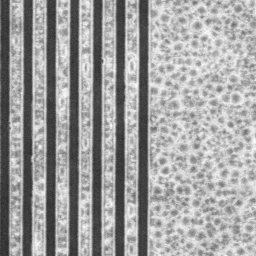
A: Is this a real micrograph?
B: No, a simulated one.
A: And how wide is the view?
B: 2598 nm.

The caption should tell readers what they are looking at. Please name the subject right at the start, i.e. parallel lines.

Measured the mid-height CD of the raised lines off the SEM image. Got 119 nm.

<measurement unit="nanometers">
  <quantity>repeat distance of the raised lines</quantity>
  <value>234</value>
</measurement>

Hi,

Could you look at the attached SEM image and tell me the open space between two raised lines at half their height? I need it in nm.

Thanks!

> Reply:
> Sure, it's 118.